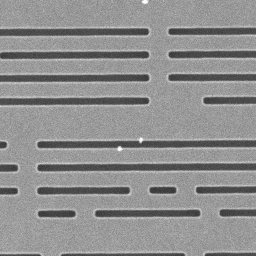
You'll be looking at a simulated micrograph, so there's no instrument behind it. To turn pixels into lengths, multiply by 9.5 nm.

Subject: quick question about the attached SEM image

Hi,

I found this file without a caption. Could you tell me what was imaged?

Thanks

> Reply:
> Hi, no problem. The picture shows groups of lines, slits or small figures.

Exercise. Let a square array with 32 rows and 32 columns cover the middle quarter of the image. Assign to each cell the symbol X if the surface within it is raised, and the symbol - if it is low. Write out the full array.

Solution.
XXXXXXXXXXXXXXXXXXXXXXXXXXXXXXXX
XXXXXXXXXXXXXXXXXXXXXXXXXXXXXXXX
XXXXXXXXXXX----------XXXXXX-----
---------------------XXXXX------
---------------------XXXXXXXXXXX
XXXXXXXXXXXXXXXXXXXXXXXXXXXXXXXX
XXXXXXXXXXXXXXXXXXXXXXXXXXXXXXXX
XXXXXXXXXXXXXXXXXXXXXXXXXXXXXXXX
---------------------XXXXXXXXXXX
---------------------XXXXXXXXXXX
XXXXXXXXXXXXXXXXXXXXXXXXXXXXXXXX
XXXXXXXXXXXXXXXXXXXXXXXXXXXXXXXX
XXXXXXXXXXXXXXXXXXXXXXXXXXXXXXXX
XXXXXXXXXXXXXXXXXXXXXXXXXXXXXXXX
XXXXXXXXXXXXXXXXXXXXXXXXXXXXXXXX
XXXXXXXXXXXXXXXXXXXXXXXXXXXXXXXX
XXXXXXXXXXXXXXXXXXXXXXXXXXXXXXXX
XXXXXXXXXXXXXXXXXXXXXXXXXXXXXXXX
XXXXXXXXXXXXXXXXXXXXXXXXXXXXXXXX
--------------------------------
--------------------------------
XXXXXXXXXXXXXXXXXXXXXXXXXXXXXXXX
XXXXXXXXXXXXXXXXXXXXXXXXXXXXXXXX
XXXXXXXXXXXXXXXXXXXXXXXXXXXXXXXX
XXXXXXXXXXXXXXXXXXXXXXXXXXXXXXXX
--------------------------------
--------------------------------
XXXXXXXXXXXXXXXXXXXXXXXXXXXXXXXX
XXXXXXXXXXXXXXXXXXXXXXXXXXXXXXXX
XXXXXXXXXXXXXXXXXXXXXXXXXXXXXXXX
XXXXXXXXXXXXXXXXXXXXXXXXXXXXXXXX
-----------------XXXX-------XXXX